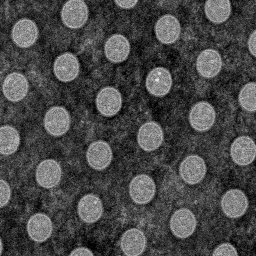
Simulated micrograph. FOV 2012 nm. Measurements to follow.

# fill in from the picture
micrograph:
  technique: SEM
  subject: a regular array of raised bodies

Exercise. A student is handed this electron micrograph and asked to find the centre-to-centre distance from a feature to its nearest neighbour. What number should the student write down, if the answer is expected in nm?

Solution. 421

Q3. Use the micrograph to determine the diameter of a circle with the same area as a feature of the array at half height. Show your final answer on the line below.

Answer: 214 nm